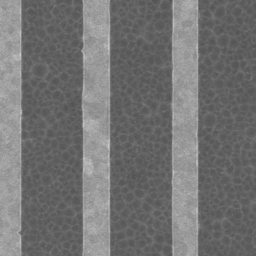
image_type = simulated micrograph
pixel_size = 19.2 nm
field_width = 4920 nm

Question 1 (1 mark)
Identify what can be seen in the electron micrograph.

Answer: one or a few lines or trenches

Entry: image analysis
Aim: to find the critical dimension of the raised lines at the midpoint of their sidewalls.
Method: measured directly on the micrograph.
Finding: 473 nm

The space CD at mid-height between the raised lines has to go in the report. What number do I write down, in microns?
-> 1.21